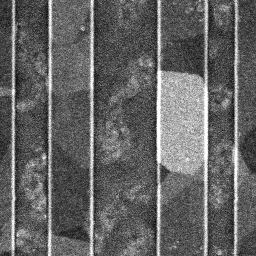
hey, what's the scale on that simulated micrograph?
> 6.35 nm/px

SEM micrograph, one or a few lines or trenches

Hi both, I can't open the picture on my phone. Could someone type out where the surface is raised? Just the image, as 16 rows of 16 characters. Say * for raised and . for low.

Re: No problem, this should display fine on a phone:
*..***....***..*
*..***....***..*
*..***....***..*
*..***....***..*
*..***....***..*
*..***....***..*
*..***....***..*
*..***....***..*
*..***....***..*
*..***....***..*
*..***....***..*
*..***....***..*
*..***....***..*
*..***....***..*
*..***....***..*
*..***....***..*